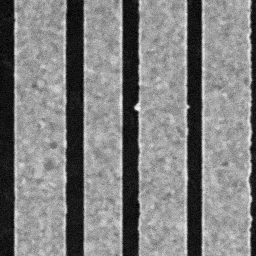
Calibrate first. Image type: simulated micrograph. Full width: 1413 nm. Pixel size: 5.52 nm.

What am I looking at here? one or a few lines or trenches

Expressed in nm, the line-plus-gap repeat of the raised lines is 342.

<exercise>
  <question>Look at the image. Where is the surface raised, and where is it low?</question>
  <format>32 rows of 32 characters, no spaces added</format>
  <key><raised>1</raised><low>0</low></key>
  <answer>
00111111000111100011111001111110
00111111000111100111111001111110
00111111000111100011111001111110
00111111000111100011111001111110
00111111000111100011111001111110
00111111000111100011111001111110
00111111000111100111111001111110
00111111000111100011111001111110
00111111000111100111111001111110
00111111000111100011111001111110
00111111000111100011111001111110
00111111000111100111111001111110
00111111000111100011111001111110
00111111000111100111111001111110
00111111000111100111111001111110
00111111000111100011111001111110
00111111000111100011111001111110
00111111000111100111111001111110
00111111000111100011111001111110
00111111000111100011111001111110
00111111000111100111111001111110
00111111000111100111111001111110
00111111000111100011111001111110
00111111000111100011111001111110
00111111000111100111111001111110
00111111000111100011111001111110
00111111000111100011111001111110
00111111000111100011111001111110
00111111000111100111111001111110
00111111000111100011111001111110
00111111000111100111111001111110
00111111000111100011111001111110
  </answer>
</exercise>